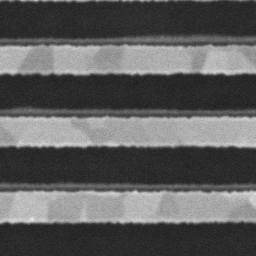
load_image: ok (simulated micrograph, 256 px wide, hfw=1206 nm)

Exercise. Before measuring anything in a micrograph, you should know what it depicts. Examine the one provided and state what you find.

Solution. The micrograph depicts lines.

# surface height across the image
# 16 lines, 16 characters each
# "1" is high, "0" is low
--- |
0000000000000000
0000000000000000
0000000000000000
1111111111111111
1111111111111111
0000000000000000
0000000000000000
1111111111111111
1111111111111111
0000000000000000
0000000000000000
0000000000000000
1111111111111111
1111111111111111
0000000000000000
0000000000000000